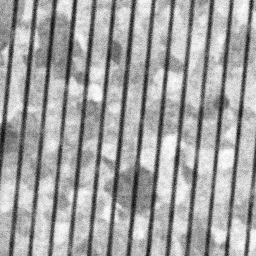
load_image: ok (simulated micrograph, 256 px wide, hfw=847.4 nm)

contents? parallel lines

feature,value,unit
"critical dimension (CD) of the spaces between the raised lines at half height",17.3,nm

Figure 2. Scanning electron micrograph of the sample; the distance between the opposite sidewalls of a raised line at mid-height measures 46.1 nanometres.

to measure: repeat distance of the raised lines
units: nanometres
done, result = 64.6